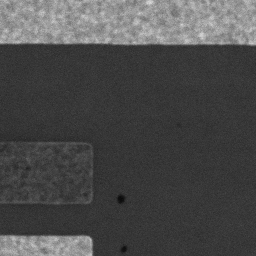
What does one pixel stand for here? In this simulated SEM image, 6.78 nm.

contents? wiring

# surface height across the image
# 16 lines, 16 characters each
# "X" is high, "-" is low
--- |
XXXXXXXXXXXXXXXX
XXXXXXXXXXXXXXXX
XXXXXXXXXXXXXXXX
----------------
----------------
----------------
----------------
----------------
----------------
XXXXXX----------
XXXXXX----------
XXXXXX----------
XXXXX-----------
----------------
----------------
XXXXXX----------